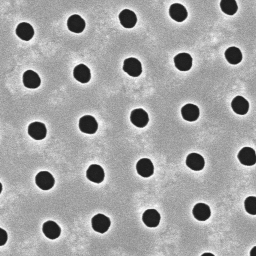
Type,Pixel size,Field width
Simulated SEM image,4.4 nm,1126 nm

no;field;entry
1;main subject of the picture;a regular array of holes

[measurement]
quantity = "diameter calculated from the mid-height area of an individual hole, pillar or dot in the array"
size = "81.9 nanometres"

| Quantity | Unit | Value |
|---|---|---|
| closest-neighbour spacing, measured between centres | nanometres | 219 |